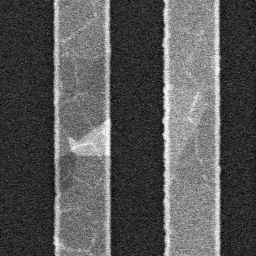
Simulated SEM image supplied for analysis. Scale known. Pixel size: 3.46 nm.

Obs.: one or a few lines or trenches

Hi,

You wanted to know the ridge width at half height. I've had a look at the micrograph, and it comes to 178 nanometres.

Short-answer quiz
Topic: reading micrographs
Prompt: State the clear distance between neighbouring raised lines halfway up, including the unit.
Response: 204 nm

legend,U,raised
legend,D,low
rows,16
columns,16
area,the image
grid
DDDDUUUDDDUUUUDD
DDDDUUUDDDUUUUDD
DDDDUUUDDDUUUUDD
DDDDUUUDDDUUUUDD
DDDDUUUDDDUUUUDD
DDDDUUUDDDUUUUDD
DDDDUUUDDDUUUUDD
DDDDUUUDDDUUUUDD
DDDDUUUDDDUUUUDD
DDDDUUUDDDUUUUDD
DDDDUUUDDDUUUUDD
DDDDUUUDDDUUUUDD
DDDDUUUDDDUUUUDD
DDDDUUUDDDUUUUDD
DDDDUUUDDDUUUUDD
DDDDUUUDDDUUUUDD